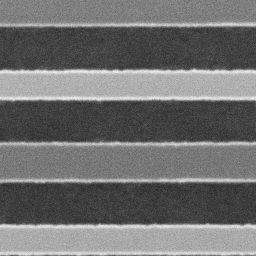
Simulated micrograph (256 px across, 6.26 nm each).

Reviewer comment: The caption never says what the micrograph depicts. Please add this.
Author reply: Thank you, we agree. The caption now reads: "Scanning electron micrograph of lines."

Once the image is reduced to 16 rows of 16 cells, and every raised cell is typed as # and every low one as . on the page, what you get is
################
################
................
................
################
################
................
................
................
################
################
................
................
................
################
################